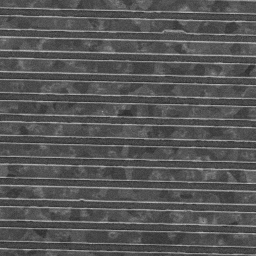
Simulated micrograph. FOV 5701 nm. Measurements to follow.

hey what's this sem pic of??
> parallel lines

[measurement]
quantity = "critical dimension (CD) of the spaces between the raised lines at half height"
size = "8.5 pixels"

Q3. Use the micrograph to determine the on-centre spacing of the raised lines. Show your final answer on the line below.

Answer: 472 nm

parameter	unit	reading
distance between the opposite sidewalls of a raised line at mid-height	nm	284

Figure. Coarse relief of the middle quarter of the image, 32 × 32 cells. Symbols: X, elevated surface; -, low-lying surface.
XXXXXXXXXXXXXXXXXXXXXXXXXXXXXXXX
XXXXXXXXXXXXXXXXXXXXXXXXXXXXXXXX
-----------XXX--X-XXXXXXXXXXXXXX
--------------------------------
XXXXX---------------------------
XXXXXXXXXXXXXXXXXXXXXXXXXXXXXXXX
XXXXXXXXXXXXXXXXXXXXXXXXXXXXXXXX
-------XXXXXXXXXXXXXXXXXXXXXXXXX
--------------------------------
--------------------------------
XXXXXXXXXXXXXXXXXXXXXXXXXXXXXXXX
XXXXXXXXXXXXXXXXXXXXXXXXXXXXXXXX
XXXXXXXXXXXXXXXXXXXXXXXXXXXXXXXX
---------------------------XX--X
--------------------------------
XXXXXXXXXXXXXXXXXXXXX----XXXXX--
XXXXXXXXXXXXXXXXXXXXXXXXXXXXXXXX
XXXXXXXXXXXXXXXXXXXXXXXXXXXXXXXX
-------------------XXXXXXXXXXXXX
--------------------------------
XXXXXXXXX-----------------------
XXXXXXXXXXXXXXXXXXXXXXXXXXXXXXXX
XXXXXXXXXXXXXXXXXXXXXXXXXXXXXXXX
-----------XXXXXXXXXXXXXXXXXXXXX
--------------------------------
--------------------------------
XXXXXXXXXXXXXXXXXXXXXXXXXXXXXXXX
XXXXXXXXXXXXXXXXXXXXXXXXXXXXXXXX
XXXXXXXXXXXXXXXXXXXXXXXXXXXXXXXX
-------------------------------X
--------------------------------
XXXXXXXXXXXXXXXXXXXXXXXXX-------